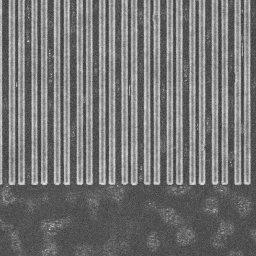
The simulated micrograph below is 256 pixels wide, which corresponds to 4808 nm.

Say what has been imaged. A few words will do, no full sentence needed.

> parallel lines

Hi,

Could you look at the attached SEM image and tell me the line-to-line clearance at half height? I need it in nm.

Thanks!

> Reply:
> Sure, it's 130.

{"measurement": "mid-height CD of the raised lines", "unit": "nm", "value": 86.9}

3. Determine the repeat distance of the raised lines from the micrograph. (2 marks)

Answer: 11.2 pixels